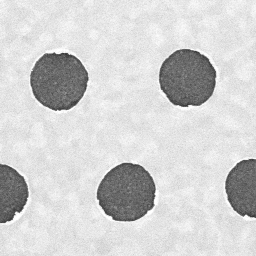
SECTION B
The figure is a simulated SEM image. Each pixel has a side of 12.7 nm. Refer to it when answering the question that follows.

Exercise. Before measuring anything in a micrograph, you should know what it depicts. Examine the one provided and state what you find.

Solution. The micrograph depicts holes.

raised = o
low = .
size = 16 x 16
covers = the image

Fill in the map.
oooooooooooooooo
oooooooooooooooo
oooooooooooooooo
ooo..oooooo..ooo
oo...ooooo...ooo
oo...ooooo...ooo
ooo..oooooo..ooo
oooooooooooooooo
oooooooooooooooo
oooooooooooooooo
.oooooo..oooooo.
..oooo....oooo..
..oooo....oooo..
.oooooo..oooooo.
oooooooooooooooo
oooooooooooooooo